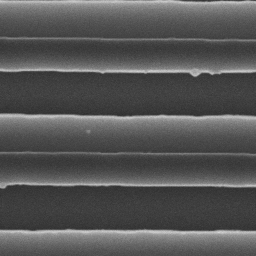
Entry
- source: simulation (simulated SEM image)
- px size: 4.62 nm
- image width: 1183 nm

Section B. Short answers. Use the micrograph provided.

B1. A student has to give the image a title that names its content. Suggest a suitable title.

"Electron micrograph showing lines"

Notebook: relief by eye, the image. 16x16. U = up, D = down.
UUUUUUUUUUUUUUUU
UUUUUUUUUUUUUUUU
UUUUUUUUUUUUUUUU
UUUUUUUUUUUUUUUU
DDDDDDUDDUUUUUDD
DDDDDDDDDDDDDDDD
DDDDDDDDDDDDDDDD
UUUUUUUUUUUUUUUU
UUUUUUUUUUUUUUUU
UUUUUUUUUUUUUUUU
UUUUUUUUUUUUUUUU
UDDUUUUUUUUUUUUU
DDDDDDDDDDDDDDDD
DDDDDDDDDDDDDDDD
UUUUUUUUUUUDDUUU
UUUUUUUUUUUUUUUU